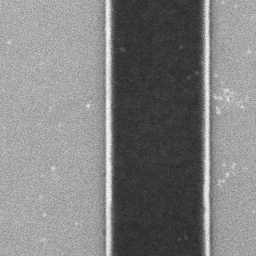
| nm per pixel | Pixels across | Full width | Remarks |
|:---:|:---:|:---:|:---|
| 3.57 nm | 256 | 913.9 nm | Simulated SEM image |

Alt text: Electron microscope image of one or a few lines or trenches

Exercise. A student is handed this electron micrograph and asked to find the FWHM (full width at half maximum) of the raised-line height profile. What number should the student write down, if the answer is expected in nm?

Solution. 361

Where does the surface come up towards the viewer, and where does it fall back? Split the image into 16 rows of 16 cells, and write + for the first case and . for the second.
.......++++++...
.......++++++...
.......++++++...
.......++++++...
.......++++++...
.......++++++...
.......++++++...
.......++++++...
.......++++++...
.......++++++...
.......++++++...
.......++++++...
.......++++++...
.......++++++...
.......++++++...
.......++++++...